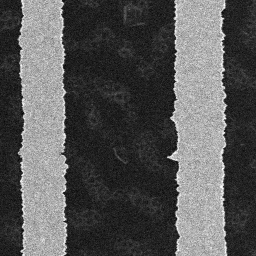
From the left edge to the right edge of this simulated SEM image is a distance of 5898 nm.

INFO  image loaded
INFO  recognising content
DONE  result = one or a few lines or trenches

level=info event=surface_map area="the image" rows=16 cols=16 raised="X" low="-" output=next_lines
-XXX----X--XXX--
-XXX----X--XXX--
-XXX-------XXX--
-XXX-------XXX--
-XXX-------XXX--
-XXX-------XXX--
-XXX-------XXX--
-XXX-------XXX--
-XXX-------XXX--
-XXX-------XXX--
-XXX-------XXX--
-XXX-------XXX--
-XXX-------XXX--
-XXX-------XXX--
-XXX-------XXX--
-XXX-------XXX--